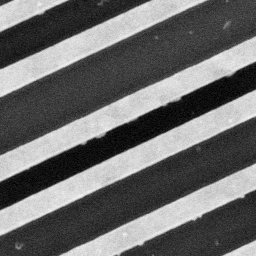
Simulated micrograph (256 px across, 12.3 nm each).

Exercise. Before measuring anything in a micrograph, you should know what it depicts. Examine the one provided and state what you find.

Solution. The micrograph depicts lines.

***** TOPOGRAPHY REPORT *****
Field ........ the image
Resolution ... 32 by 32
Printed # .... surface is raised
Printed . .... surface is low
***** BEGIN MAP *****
.######...........#######.......
#####...........#######.........
###...........######............
#...........######..............
.........#######................
.......#######................##
.....#######................####
...#######................######
.#######................######..
######................######....
###................#######......
#................#######.......#
...............#######.......###
.............#######.......#####
...........#######.......#######
.........######........#######..
.......######........#######....
....#######........#######......
..#######........######.........
#######........######...........
#####.......#######.............
###.......#######.............##
........#######.............####
......#######............#######
....######.............#######..
..######.............#######....
######.............#######......
####.............#######........
##.............#######..........
.............######.............
...........######..............#
.........######..............###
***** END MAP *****